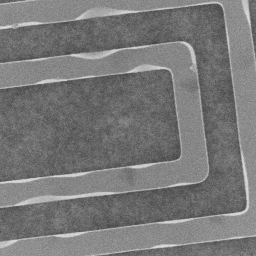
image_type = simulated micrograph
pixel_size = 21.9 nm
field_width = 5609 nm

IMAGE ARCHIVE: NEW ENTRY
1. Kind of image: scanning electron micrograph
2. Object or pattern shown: groups of lines, slits or small figures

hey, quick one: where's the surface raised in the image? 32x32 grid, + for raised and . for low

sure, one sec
+++++++++++++++++++++++++..++++.
++++++++++++++++............+++.
+++++++++...................+++.
............................+++.
............................++++
....................+++......+++
..............++++++++++.....+++
....++++++++++++++++++++.....+++
++++++++++++++++++..+++++....+++
+++++++++++++.........+++....+++
++++..................+++....+++
......................+++....+++
......................+++....+++
......................+++.....++
......................+++.....++
......................+++.....++
......................++++....++
.......................+++....++
.......................+++....++
.......................+++....++
...................+++++++....++
...........+++++++++++++++.....+
....+++++++++++++++++++++......+
++++++++++++++++++++...........+
++++++++++.....................+
+++............................+
..............................++
.......................+++++++++
..............++++++++++++++++++
......+.++++++++++++++++++++++++
+++++++++++++++++++++++.........
+++++++++++++++.................